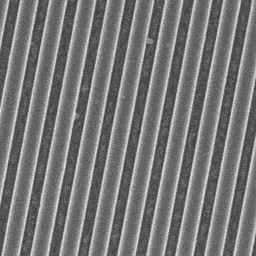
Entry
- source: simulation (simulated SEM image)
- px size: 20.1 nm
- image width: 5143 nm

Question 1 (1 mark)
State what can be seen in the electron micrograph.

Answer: parallel lines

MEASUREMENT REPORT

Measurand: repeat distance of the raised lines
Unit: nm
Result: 572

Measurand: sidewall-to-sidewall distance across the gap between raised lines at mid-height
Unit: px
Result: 11.8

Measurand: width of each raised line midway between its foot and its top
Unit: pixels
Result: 16.8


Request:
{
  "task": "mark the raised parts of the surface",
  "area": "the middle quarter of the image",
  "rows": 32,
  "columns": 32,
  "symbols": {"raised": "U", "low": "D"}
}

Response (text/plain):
DUUUUDDDUUUUDDDUUUUDDDUUUUUDDUUU
UUUUUDDDUUUUDDDUUUUDDDUUUUDDDUUU
UUUUDDDDUUUUDDDUUUUDDDUUUUDDDUUU
UUUUDDDUUUUDDDDUUUUDDDUUUUDDDUUU
UUUUDDDUUUUDDDUUUUUDDDUUUUDDDUUU
UUUUDDDUUUUDDDUUUUDDDDUUUUDDDUUU
UUUUDDDUUUUDDDUUUUDDDUUUUDDDDUUU
UUUDDDDUUUUDDDUUUUDDDUUUUDDDUUUU
UUUDDDUUUUUDDDUUUUDDDUUUUDDDUUUU
UUUDDDUUUUDDDUUUUUDDDUUUUDDDUUUU
UUUDDDUUUUDDDUUUUDDDDUUUUDDDUUUU
UUUDDDUUUUDDDUUUUDDDUUUUUDDDUUUU
UUUDDDUUUUDDDUUUUDDDUUUUDDDUUUUU
UUDDDUUUUUDDDUUUUDDDUUUUDDDUUUUD
UUDDDUUUUDDDDUUUUDDDUUUUDDDUUUUD
UUDDDUUUUDDDUUUUUDDDUUUUDDDUUUUD
UUDDDUUUUDDDUUUUDDDUUUUUDDDUUUUD
UUDDDUUUUDDDUUUUDDDUUUUDDDDUUUUD
UDDDDUUUUDDDUUUUDDDUUUUDDDUUUUUD
UDDDUUUUDDDDUUUUDDDUUUUDDDUUUUDD
UDDDUUUUDDDUUUUUDDDUUUUDDDUUUUDD
UDDDUUUUDDDUUUUDDDDUUUUDDDUUUUDD
UDDDUUUUDDDUUUUDDDUUUUDDDDUUUUDD
UDDDUUUUDDDUUUUDDDUUUUDDDUUUUUDD
UDDUUUUUDDDUUUUDDDUUUUDDDUUUUDDD
DDDUUUUDDDUUUUUDDDUUUUDDDUUUUDDD
DDDUUUUDDDUUUUDDDDUUUUDDDUUUUDDD
DDDUUUUDDDUUUUDDDUUUUUDDDUUUUDDD
DDDUUUUDDDUUUUDDDUUUUDDDDUUUUDDD
DDUUUUUDDDUUUUDDDUUUUDDDUUUUDDDU
DDUUUUDDDDUUUUDDDUUUUDDDUUUUDDDU
DDUUUUDDDUUUUUDDDUUUUDDDUUUUDDDU